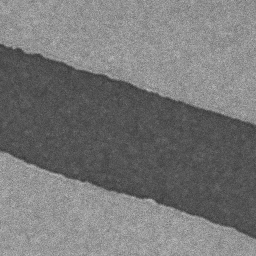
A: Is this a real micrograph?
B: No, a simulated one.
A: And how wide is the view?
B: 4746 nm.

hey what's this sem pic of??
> one or a few lines or trenches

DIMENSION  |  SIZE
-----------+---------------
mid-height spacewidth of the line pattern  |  1980 nanometers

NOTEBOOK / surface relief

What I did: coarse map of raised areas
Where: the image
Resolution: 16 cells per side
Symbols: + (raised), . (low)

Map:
++++++++++++++++
++++++++++++++++
++++++++++++++++
...+++++++++++++
......++++++++++
.........+++++++
............++++
...............+
................
................
++..............
++++++..........
+++++++++.......
++++++++++++....
+++++++++++++++.
++++++++++++++++